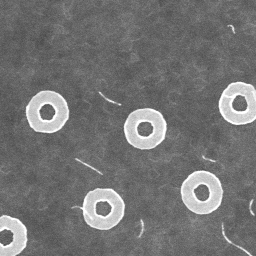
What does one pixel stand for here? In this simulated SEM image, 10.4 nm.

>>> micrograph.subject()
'ring-shaped raised bodies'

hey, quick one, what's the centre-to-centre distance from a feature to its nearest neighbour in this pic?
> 0.913 micrometres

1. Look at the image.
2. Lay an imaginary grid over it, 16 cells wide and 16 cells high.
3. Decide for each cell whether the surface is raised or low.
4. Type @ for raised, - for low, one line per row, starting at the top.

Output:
----------------
----------------
----------------
----------------
----------------
--------------@@
--@@----------@@
--@@----@@----@@
--------@@------
----------------
----------------
-----------@@@--
-----@@@---@@@--
-----@@@--------
-@--------------
@---------------